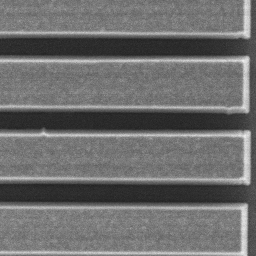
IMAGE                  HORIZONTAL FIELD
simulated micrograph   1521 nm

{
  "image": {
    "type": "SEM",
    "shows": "one or a few lines or trenches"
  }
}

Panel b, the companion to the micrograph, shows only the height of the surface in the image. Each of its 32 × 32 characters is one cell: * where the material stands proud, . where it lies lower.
*******************************.
*******************************.
*******************************.
*******************************.
................................
................................
................................
*******************************.
*******************************.
*******************************.
*******************************.
*******************************.
*******************************.
*******************************.
................................
................................
.....*..........................
*******************************.
*******************************.
*******************************.
*******************************.
*******************************.
*******************************.
................................
................................
................................
*******************************.
*******************************.
*******************************.
*******************************.
*******************************.
*******************************.